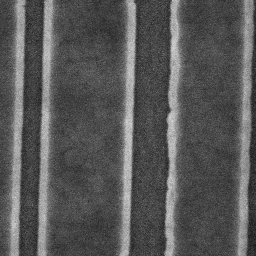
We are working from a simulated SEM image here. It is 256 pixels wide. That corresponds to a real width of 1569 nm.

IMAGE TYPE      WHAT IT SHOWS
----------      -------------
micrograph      one or a few lines or trenches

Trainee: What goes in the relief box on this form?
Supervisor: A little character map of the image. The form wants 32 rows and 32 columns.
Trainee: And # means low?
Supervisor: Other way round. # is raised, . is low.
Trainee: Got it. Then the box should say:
###...##########......#########.
###...###########.....#########.
###...###########.....#########.
###...###########.....#########.
###...###########.....#########.
###...##########......#########.
###...##########......#########.
###...##########......#########.
###...##########......#########.
##....##########......#########.
##....##########......#########.
###...##########.....##########.
##....##########.....##########.
##....##########......#########.
##....##########.....##########.
##....##########.....##########.
##....##########.....##########.
##....##########......#########.
##...###########.....##########.
##...###########.....##########.
##...###########.....##########.
##...###########.....##########.
##...###########.....##########.
##...###########.....##########.
##...###########.....##########.
##...###########.....##########.
##...###########.....##########.
##...###########.....##########.
##...###########.....##########.
##...###########.....#########..
##...###########.....#########..
##...###########.....#########..